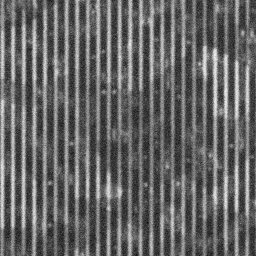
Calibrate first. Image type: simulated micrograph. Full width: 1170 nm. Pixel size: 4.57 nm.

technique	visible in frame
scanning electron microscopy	parallel lines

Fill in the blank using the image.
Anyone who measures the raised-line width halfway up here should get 10.3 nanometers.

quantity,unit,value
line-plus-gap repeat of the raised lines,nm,48.6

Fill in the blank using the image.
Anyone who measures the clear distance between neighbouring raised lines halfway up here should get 0.036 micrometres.